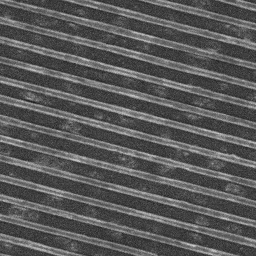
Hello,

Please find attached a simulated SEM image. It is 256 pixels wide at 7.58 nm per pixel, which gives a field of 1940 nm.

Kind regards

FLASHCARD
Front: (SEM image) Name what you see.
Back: parallel lines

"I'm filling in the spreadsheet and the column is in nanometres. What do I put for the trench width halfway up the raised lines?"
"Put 103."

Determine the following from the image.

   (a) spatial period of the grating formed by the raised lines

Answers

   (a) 0.145 um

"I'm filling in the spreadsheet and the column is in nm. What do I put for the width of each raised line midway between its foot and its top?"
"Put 41.2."